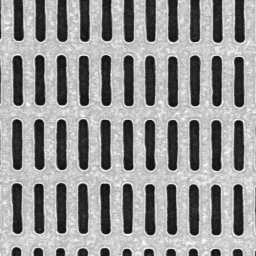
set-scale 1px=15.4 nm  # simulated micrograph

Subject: a regular array of holes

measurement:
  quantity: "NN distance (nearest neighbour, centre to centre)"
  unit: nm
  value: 339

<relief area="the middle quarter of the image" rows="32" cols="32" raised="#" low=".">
.###..###...###...##...###..###.
.###..###...###...##...###..###.
.###..###...###...##...###...##.
.###..###...###...##...###...##.
.###..###...###...##...###...##.
.###..###...###...##...###...##.
.###..###...###...##...###...##.
.###..###...###...##...###...##.
.###..###...###...##...###...##.
.###..###...###..###...###...##.
#####.####.#####.##########.####
################################
################################
################################
####..###...###..###..####..###.
.##...###...###..###...###...##.
.##...###...###..###...###...##.
.##...###...###..###...###...##.
.##...###...###..###...###...##.
.##...###...###..###...###...##.
.##...###...###..###...###...##.
.##...###...###..###...###...##.
.##...###...###..###...###...##.
.##...###...###..###...###...##.
.###..###...###..###...###..###.
.###..###...###..###...###..###.
##########.####..####.####..####
################################
################################
################################
.###..###..####..###...###..###.
.##...###...###..###...###..###.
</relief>